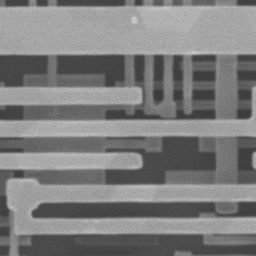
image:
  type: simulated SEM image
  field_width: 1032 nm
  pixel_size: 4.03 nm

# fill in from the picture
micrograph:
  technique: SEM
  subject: wiring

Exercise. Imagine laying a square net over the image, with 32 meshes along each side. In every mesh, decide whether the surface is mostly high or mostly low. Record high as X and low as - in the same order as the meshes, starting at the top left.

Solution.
--------------------------------
XXXXXXXXXXXXXXXXXXXXXXXXXXXXXXXX
XXXXXXXXXXXXXXXXXXXXXXXXXXXXXXXX
XXXXXXXXXXXXXXXXXXXXXXXXXXXXXXXX
XXXXXXXXXXXXXXXXXXXXXXXXXXXXXXXX
XXXXXXXXXXXXXXXXXXXXXXXXXXXXXXXX
XXXXXXXXXXXXXXXXXXXXXXXXXXXXXXXX
--------------------------------
--------------------------------
--------------------------------
--------------------------------
XXXXXXXXXXXXXXXXXX--------------
XXXXXXXXXXXXXXXXXX--------------
--------------------------------
-------------------------------X
XXXXXXXXXXXXXXXXXXXXXXXXXXXXXXXX
XXXXXXXXXXXXXXXXXXXXXXXXXXXXXXXX
--------------------------------
--------------------------------
XXXXXXXXXXXXXXXXXX--------------
XXXXXXXXXXXXXXXXXX--------------
--------------------------------
-XXX----------------------------
-XXXXXXXXXXXXXXXXXXXXXXXXXXXXXXX
-XXXXXXXXXXXXXXXXXXXXXXXXXXXXXXX
-XXXX---------------------------
--XX----------------------------
--XXXXXXXXXXXXXXXXXXXXXXXXXXXXXX
--XXXXXXXXXXXXXXXXXXXXXXXXXXXXXX
--------------------------------
--------------------------------
--------------------------------